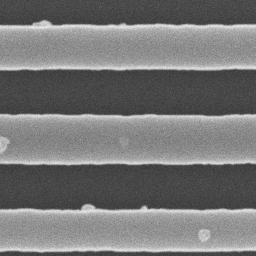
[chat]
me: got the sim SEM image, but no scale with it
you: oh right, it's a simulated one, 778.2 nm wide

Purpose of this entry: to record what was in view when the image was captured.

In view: lines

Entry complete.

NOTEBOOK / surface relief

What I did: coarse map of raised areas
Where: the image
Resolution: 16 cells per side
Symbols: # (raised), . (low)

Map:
................
................
################
################
................
................
................
################
################
################
................
................
................
################
################
################